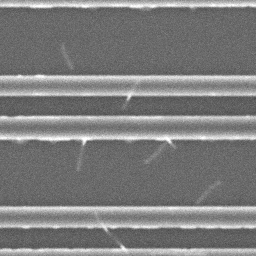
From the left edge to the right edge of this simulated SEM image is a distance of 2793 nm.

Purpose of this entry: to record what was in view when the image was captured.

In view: lines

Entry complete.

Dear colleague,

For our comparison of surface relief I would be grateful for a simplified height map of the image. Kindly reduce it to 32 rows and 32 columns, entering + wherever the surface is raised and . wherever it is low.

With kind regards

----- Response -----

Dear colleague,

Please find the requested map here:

++++++++++++++++++++++++++++++++
................................
................................
................................
................................
................................
................................
................................
................................
....++..........................
++++++++++++++++++++++++++++++++
++++++++++++++++++++++++++++++++
................................
................................
................................
++++++++++++++++++++++++++++++++
++++++++++++++++++++++++++++++++
..........+.....................
................................
................................
................................
................................
................................
................................
................................
................................
++++++++++++++++++++++++++++++++
++++++++++++++++++++++++++++++++
................................
................................
................................
++++++++++++++++++++++++++++++++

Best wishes